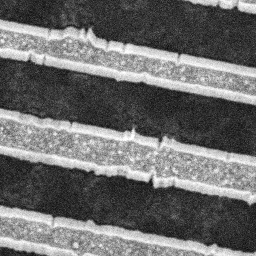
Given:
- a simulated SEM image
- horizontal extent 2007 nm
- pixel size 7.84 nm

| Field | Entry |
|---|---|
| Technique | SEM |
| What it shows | one or a few lines or trenches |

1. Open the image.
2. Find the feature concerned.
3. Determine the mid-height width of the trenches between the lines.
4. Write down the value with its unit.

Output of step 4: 0.477 micrometres